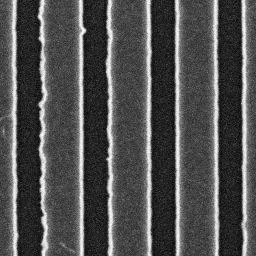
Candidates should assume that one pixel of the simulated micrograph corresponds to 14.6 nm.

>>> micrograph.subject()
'one or a few lines or trenches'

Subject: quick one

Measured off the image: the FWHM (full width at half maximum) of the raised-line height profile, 577 nm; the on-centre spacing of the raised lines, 987 nm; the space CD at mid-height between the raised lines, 0.406 um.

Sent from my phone